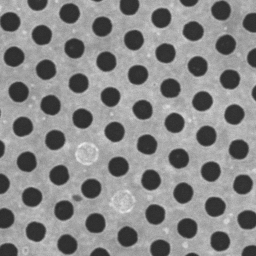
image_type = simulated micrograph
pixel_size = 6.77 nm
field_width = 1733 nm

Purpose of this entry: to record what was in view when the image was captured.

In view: a regular array of holes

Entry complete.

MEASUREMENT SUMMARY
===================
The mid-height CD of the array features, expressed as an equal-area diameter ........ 141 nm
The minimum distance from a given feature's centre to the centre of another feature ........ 234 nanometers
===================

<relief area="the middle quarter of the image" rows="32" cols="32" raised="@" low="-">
@@@@@@@@-----@@@@---@@@@@@@@@@@-
@@@@@@@@@---@@@@-----@@@@@@@@@@-
@@@--@@@@@@@@@@@-----@@@@@@@@@@@
@-----@@@@@@@@@@-----@@@@@@@@@@@
@-----@@@@@@@@@@----@@@@@----@@@
@-----@@@@@@@@@@@@@@@@@@-----@@@
@@----@@@@----@@@@@@@@@@-----@@@
@@@@@@@@@-----@@@@@@@@@@-----@@@
@@@@@@@@@-----@@@@@@@@@@@--@@@@@
@@@@@@@@@@----@@@@---@@@@@@@@@@@
@@@@@@@@@@@--@@@@-----@@@@@@@@@@
@@@---@@@@@@@@@@@-----@@@@@@@@@@
@@-----@@@@@@@@@@-----@@@@---@@@
@@-----@@@@@@@@@@@---@@@@-----@@
@@-----@@@@@--@@@@@@@@@@@-----@@
@@@---@@@@@----@@@@@@@@@@-----@@
@@@@@@@@@@-----@@@@@@@@@@@----@@
@@@@@@@@@@-----@@@@@@@@@@@@@@@@@
@@@@@@@@@@@----@@@@----@@@@@@@@@
@@@@@@@@@@@@-@@@@@-----@@@@@@@@@
@@@@@@@@@@@@@@@@@@-----@@@@@@@@@
@@@@@@@@@@@@@@@@@@-----@@@@---@@
@@@@@@@@@@@@@@@@@@@@--@@@@-----@
@@@@@@@@@@@@---@@@@@@@@@@@-----@
@@@@@@@@@@@-----@@@@@@@@@@-----@
@@@@@@@@@@@-----@@@@@@@@@@@----@
-@@@@@@@@@@-----@@@@--@@@@@@@@@@
-@@@@@@@@@@@---@@@@@----@@@@@@@@
-@@@@@@@@@@@@@@@@@@-----@@@@@@@@
-@@@@----@@@@@@@@@@-----@@@@@@@@
@@@@-----@@@@@@@@@@@----@@@@----
@@@@-----@@@@@@@@@@@@--@@@@-----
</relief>